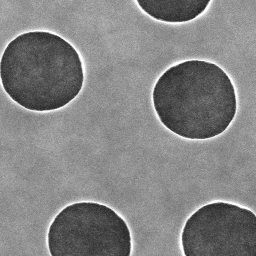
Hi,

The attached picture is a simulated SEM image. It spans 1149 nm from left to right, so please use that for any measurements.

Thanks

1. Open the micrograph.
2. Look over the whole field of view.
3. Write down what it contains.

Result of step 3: holes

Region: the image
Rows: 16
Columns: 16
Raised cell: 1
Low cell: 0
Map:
1111111110000111
1111111111111111
1000111111111111
0000011111111111
0000011111000011
0000011111000001
1000111111000001
1111111111000011
1111111111100111
1111111111111111
1111111111111111
1111111111111111
1111111111111111
1111000111110000
1110000011100000
1110000011100000